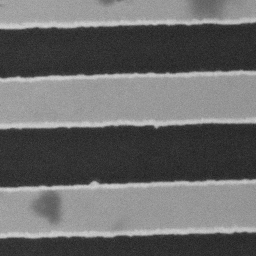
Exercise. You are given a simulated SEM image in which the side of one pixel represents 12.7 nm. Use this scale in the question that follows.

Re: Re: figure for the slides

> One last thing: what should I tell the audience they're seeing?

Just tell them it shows lines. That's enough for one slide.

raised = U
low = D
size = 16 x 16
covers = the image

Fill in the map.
UUUUUUUUUUUUUUUU
UUUUUUUUDDDDDDDD
DDDDDDDDDDDDDDDD
DDDDDDDDDDDDDDDD
DDDDDDDDDDDDDDDU
UUUUUUUUUUUUUUUU
UUUUUUUUUUUUUUUU
UUUUUUUUUUUUUUUU
DDDDDDDDDDDDDDDD
DDDDDDDDDDDDDDDD
DDDDDDDDDDDDDDDD
DDDDDDDDDUUUUUUU
UUUUUUUUUUUUUUUU
UUUUUUUUUUUUUUUU
UUUUUUUUUUUUUUDD
DDDDDDDDDDDDDDDD